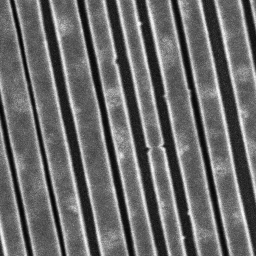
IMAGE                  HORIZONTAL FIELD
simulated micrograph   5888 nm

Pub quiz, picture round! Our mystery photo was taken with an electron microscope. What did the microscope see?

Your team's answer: parallel lines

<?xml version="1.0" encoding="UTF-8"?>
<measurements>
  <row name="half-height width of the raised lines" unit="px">23.5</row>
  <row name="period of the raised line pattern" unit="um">0.736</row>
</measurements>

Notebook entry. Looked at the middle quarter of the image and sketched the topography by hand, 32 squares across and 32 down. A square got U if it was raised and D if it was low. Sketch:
UUUUUUDDDUUUUDDDDUUUUDDDUUUUUUDD
UUUUUUUDDUUUUUDDDUUUUDDDUUUUUUDD
UUUUUUUDDUUUUUDDDUUUUDDDUUUUUUDD
UUUUUUUDDUUUUUDDDUUUUUDDDUUUUUUD
DUUUUUUDDUUUUUDDDDUUUUDDDUUUUUUD
DUUUUUUUDDUUUUDDDDUUUUDDDUUUUUUD
DUUUUUUUDDUUUUUDDDUUUUDDDUUUUUUD
DUUUUUUUDDUUUUUDDDUUUUDDDUUUUUUU
DUUUUUUUDDUUUUUDDDUUUUUDDUUUUUUU
DDUUUUUUDDUUUUUDDDDUUUUDDDUUUUUU
DDUUUUUUUDDUUUUDDDDUUUUDDDUUUUUU
DDUUUUUUUDDUUUUUDDDUUUUDDDUUUUUU
DDUUUUUUUDDUUUUUDDDUUUUDDDUUUUUU
DDUUUUUUUDDUUUUUDDDUUUUDDDUUUUUU
DDDUUUUUUDDUUUUUDDDUUUUUDDDUUUUU
DDDUUUUUUUDDUUUUUDDDUUUUDDDUUUUU
DDDUUUUUUUDDUUUUUDDDUUUUDDDUUUUU
DDDUUUUUUUDDUUUUUDDDUUUUDDDUUUUU
UDDUUUUUUUDDUUUUUDDDUUUUUDDDUUUU
UDDDUUUUUUDDUUUUUDDDDUUUUDDDUUUU
UDDDUUUUUUUDDUUUUDDDDUUUUDDDUUUU
UDDDUUUUUUUDDUUUUUDDDUUUUDDDUUUU
UDDDUUUUUUUDDUUUUUDDDUUUUDDDDUUU
UUDDDUUUUUUDDUUUUUDDDUUUUUDDDUUU
UUDDDUUUUUUDDUUUUUDDDDUUUUDDDUUU
UUDDDUUUUUUDDDUUUUDDDDUUUUDDDUUU
UUDDDUUUUUUUDDUUUUUDDDUUUUDDDUUU
UUDDDUUUUUUUDDUUUUUDDDUUUUDDDDUU
UUUDDUUUUUUUDDUUUUUDDDUUUUUDDDUU
UUUDDDUUUUUUDDDUUUUDDDDUUUUDDDUU
UUUDDDUUUUUUDDDUUUUDDDDUUUUDDDUU
UUUDDDUUUUUUUDDUUUUUDDDUUUUDDDUU